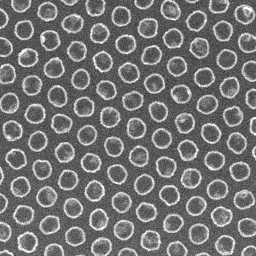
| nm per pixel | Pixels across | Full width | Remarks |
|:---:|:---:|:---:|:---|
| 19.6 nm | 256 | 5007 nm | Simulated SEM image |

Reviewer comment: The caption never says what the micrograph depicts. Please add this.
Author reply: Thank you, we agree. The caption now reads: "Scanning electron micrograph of a regular array of raised bodies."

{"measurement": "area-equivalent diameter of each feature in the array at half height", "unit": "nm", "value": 380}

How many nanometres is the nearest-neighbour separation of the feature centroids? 538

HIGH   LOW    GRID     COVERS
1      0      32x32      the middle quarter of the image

00000000111100011100000000111110
00001000011000111100000000111110
00111100000000111110000000011100
00111100000000111110011110000000
00111100011000001000111110000000
00111100111110000000111110001100
00000000111110000000011100011110
00000000011110001110000000011111
10001100001100011111000000011110
10011110000000011111000000001110
00011110000000011110011110000000
00011110001110001000011111000000
00011110011111000000001111000010
10000000011111000000001110001111
11000000011111001111000000001111
11000110001110001111000000001111
10001111000000001111000110000111
00011111000000001111001111000000
00001111000110000100001111100000
00001110001111000000001111100011
11000000001111100000000111000111
11000000000111100111100000000111
11000010000111000111100000000111
11000111100000001111100011000111
00001111100000000111100111110000
00001111100011000001000111110000
00000111000111100000000111110001
11100000000111110000000011100011
11100000000111110011110000000111
11100001100011100011110000000111
11100011110000000011110000000011
00000111110000000011110011110000